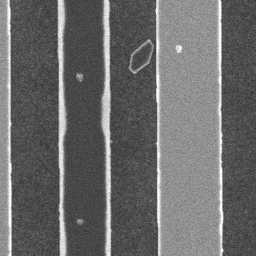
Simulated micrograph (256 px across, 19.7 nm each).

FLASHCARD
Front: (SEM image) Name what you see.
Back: lines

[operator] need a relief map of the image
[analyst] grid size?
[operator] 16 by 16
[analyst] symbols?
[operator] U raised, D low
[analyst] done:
UDDDUUUDDDUUUUDD
UDDDUUUDDDUUUUDD
UDDDUUUDDDUUUUDD
UDDDUUUDDDUUUUDD
UDDDUUUDDDUUUUDD
UDDDUUUDDDUUUUDD
UDDDUUUDDDUUUUDD
UDDDUUUDDDUUUUDD
UDDDUUUDDDUUUUDD
UDDDUUUDDDUUUUDD
UDDDUUUDDDUUUUDD
UDDDUUUDDDUUUUDD
UDDDUUUDDDUUUUDD
UDDDUUUDDDUUUUDD
UDDDUUUDDDUUUUDD
UDDDUUUDDDUUUUDD